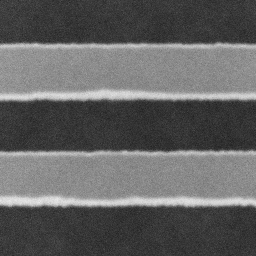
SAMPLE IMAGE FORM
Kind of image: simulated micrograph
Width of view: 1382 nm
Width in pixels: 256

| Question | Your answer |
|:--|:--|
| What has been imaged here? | lines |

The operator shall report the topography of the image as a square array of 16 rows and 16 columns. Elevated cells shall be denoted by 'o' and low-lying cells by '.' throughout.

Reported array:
................
................
................
oooooooooooooooo
oooooooooooooooo
oooooooooooooooo
................
................
................
......ooo..ooooo
oooooooooooooooo
oooooooooooooooo
oooooooooooooooo
................
................
................